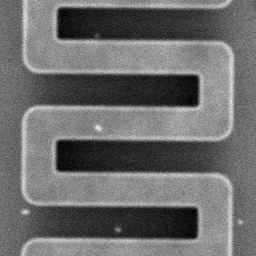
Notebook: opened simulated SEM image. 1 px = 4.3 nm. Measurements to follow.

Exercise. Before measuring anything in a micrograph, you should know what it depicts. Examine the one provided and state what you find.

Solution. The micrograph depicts groups of lines, slits or small figures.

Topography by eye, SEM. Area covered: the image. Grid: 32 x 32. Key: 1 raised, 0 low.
00011111111111111111111111110000
00011110000000000000000000000000
00011110000000000000000000000000
00011110000000000000000000000000
00011110000000000000000000000000
00011111111111111111111111110000
00011111111111111111111111111000
00011111111111111111111111111000
00001111111111111111111111111000
00000000000000000000000001111000
00000000000000000000000001111000
00000000000000000000000001111000
00000000000000000000000001111000
00001111111111111111111111111000
00011111111111111111111111111000
00011111111111111111111111111000
00011111111111111111111111111000
00011110000000000000000000000000
00011110000000000000000000000000
00011110000000000000000000000000
00011110000000000000000000000000
00011110000000000000000000000000
00011111111111111111111111110000
00011111111111111111111111111000
00011111111111111111111111111000
00001111111111111111111111111000
00000000000000000000000001111000
00000000000000000000000001111000
00000000000000000000000001111000
00000000000000000000000001111000
00011111111111111111111111111000
00011111111111111111111111111000